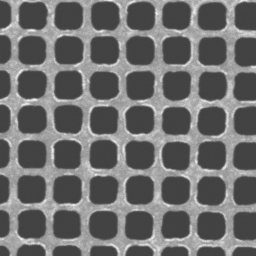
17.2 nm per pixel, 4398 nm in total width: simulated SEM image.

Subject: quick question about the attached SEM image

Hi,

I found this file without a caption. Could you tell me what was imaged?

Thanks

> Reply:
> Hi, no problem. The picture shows a regular array of holes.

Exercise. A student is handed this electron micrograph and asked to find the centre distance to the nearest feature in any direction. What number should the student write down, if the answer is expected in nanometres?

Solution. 596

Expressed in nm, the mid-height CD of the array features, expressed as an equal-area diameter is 532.